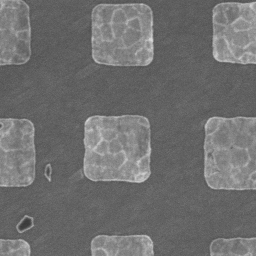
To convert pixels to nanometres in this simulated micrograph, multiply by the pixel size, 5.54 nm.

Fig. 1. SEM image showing raised bodies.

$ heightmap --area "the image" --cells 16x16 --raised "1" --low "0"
1100001110000011
1100001110000111
1100001110000111
1100001111000011
0000000000000000
0000000000000000
0000000000000000
1000001110000111
1100011110000111
1100011110000111
1100011110000011
1100000000000111
0000000000000000
0000000000000000
0000000000000000
1100001111000111